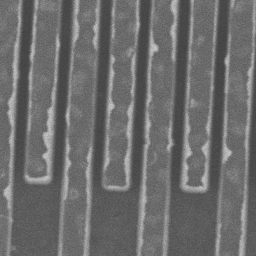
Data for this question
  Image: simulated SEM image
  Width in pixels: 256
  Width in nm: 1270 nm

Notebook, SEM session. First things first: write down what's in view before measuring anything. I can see parallel lines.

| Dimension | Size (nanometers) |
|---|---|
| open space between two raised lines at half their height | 57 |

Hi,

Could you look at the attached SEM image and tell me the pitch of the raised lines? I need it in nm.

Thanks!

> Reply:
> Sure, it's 194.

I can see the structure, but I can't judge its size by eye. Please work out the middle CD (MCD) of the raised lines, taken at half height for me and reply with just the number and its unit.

140 nanometers